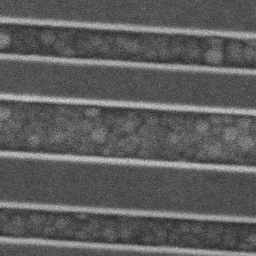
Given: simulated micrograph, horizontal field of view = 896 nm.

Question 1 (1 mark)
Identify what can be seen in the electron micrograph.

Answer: one or a few lines or trenches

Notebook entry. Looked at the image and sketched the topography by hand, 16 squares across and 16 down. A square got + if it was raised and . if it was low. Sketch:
++++++++++++++++
...+++++++++++++
................
................
++++++++++++++++
++++++++++++++++
......++++++++++
................
................
................
+++++++++++++++.
++++++++++++++++
++++++++++++++++
...........+++++
................
+++++++++.......